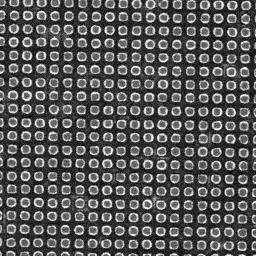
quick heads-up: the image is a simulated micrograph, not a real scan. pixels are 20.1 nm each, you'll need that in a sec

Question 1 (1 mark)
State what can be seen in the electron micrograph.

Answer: a regular array of raised bodies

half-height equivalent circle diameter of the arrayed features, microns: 0.176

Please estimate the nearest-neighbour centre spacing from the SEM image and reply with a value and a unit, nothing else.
265 nanometres